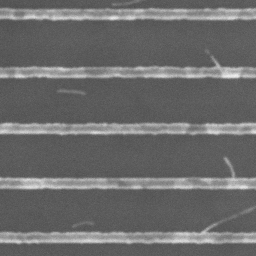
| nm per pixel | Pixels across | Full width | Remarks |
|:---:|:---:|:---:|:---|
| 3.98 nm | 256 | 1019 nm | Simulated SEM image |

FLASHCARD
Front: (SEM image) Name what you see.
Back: lines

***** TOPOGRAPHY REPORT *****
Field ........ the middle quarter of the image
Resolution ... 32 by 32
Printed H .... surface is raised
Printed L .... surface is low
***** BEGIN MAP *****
LLLLLLLLLLLLLLLLLLLLLLLLLLLLLLLL
HHHHHHHHHHHHHHHHHHHHHHHHHHHHHHHH
HHHHHHHHHHHHHHHHHHHHHHHHHHHHHHHH
LLLLLLLLLLLLLLLLLLLLLLLLLLLLLLLL
LLLLLLLLLLLLLLLLLLLLLLLLLLLLLLLL
LLLLLLLLLLLLLLLLLLLLLLLLLLLLLLLL
LLLLLLLLLLLLLLLLLLLLLLLLLLLLLLLL
LLLLLLLLLLLLLLLLLLLLLLLLLLLLLLLL
LLLLLLLLLLLLLLLLLLLLLLLLLLLLLLLL
LLLLLLLLLLLLLLLLLLLLLLLLLLLLLLLL
LLLLLLLLLLLLLLLLLLLLLLLLLLLLLLLL
LLLLLLLLLLLLLLLLLLLLLLLLLLLLLLLL
LLLLLLLLLLLLLLLLLLLLLLLLLLLLLLLL
LLLLLLLLLLLLLLLLLLLLLLLLLLLLLLLL
LLLLLLLLLLLLLLLLLLLLLLLLLLLLLLLL
HHHHHHHHHHHHHHHHHHHHHHHHHHHHHHHH
HHHHHHHHHHHHHHHHHHHHHHHHHHHHHHHH
LLLLLLLLLLLLLLLLLLLLLLLLLLLLLLLH
LLLLLLLLLLLLLLLLLLLLLLLLLLLLLLLL
LLLLLLLLLLLLLLLLLLLLLLLLLLLLLLLL
LLLLLLLLLLLLLLLLLLLLLLLLLLLLLLLL
LLLLLLLLLLLLLLLLLLLLLLLLLLLLLLLL
LLLLLLLLLLLLLLLLLLLLLLLLLLLLLLLL
LLLLLLLLLLLLLLLLLLLLLLLLLLLLLLLL
LLLLLLLLLLLLLLLLLLLLLLLLLLLLLLLL
LLLLLLLLLLLLLLLLLLLLLLLLLLLLLLLL
LLLLLLLLLLLLLLLLLLLLLLLLLLLLLLLL
LLLLLLLLLLLLLLLLLLLLLLLLLLLLLLLL
LLLLLLLLLLLLLLLLLLLLLLLLLLLLLLLL
HHHHHHHHHHHHHHHHHHHHHHHHHHHHHHHH
HHHHHHHHHHHHHHHHHHHHHHHHHHHHHHHH
LLLLLLLLLLLLLLLLLLLLLLLLLLLLLLLL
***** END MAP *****